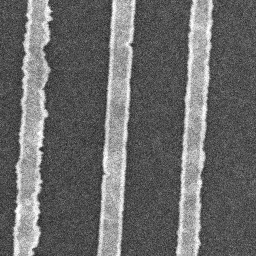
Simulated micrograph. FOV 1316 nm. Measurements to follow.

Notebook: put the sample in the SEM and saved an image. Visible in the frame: one or a few lines or trenches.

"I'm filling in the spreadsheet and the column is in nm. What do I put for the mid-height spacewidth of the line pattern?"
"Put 321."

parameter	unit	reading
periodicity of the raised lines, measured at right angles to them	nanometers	418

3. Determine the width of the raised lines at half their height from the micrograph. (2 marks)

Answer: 0.0923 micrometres